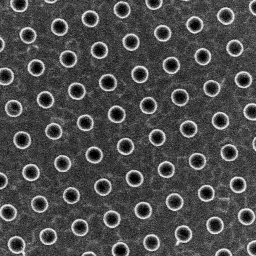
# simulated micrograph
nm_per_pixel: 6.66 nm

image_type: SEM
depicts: a regular array of raised bodies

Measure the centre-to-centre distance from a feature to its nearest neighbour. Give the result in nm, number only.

217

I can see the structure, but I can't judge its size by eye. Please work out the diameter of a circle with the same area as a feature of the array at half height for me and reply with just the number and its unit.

108 nanometers